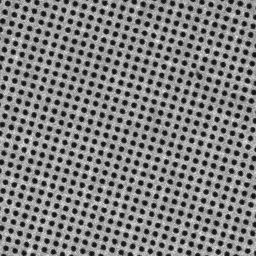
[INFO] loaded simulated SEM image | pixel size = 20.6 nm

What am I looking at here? a regular array of holes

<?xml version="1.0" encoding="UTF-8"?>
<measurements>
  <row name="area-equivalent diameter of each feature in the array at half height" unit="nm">129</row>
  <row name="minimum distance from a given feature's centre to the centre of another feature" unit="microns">0.183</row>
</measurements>